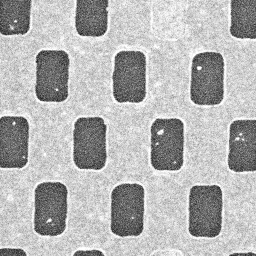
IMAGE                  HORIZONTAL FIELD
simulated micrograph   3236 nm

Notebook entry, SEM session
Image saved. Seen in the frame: a regular array of holes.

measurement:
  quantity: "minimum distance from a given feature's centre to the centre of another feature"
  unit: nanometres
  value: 968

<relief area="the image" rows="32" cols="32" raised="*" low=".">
....*****.....*****....******...
....*****.....*****...*******...
....*****.....*****...*******...
....*****....********..******...
**********...****************...
********************************
*****...*******...********.*****
****.....*****....******....****
****.....*****....******....****
****.....*****....******....****
****.....*****....******....****
****.....*****....******....****
*****...******....******....****
********************************
...********.********************
....*****....******....******...
....*****....******....******...
....*****....******....******...
....*****....******....*****....
....*****....******....*****....
...******....******....*****....
*****************************..*
********************************
****....******....******....****
****....******....******....****
****....******....******....****
****....******....*****.....****
****....******....*****.....****
****....******....*****.....****
*****..********..*******...*****
********************************
...******....****************..*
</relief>